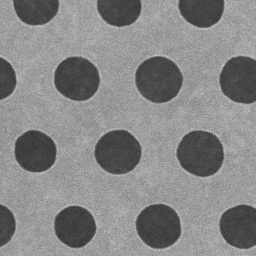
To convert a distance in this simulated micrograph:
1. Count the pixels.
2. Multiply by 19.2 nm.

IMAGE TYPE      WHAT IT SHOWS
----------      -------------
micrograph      holes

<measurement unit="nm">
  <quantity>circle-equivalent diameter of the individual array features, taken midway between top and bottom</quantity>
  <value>878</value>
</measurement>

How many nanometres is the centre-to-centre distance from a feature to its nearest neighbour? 1590